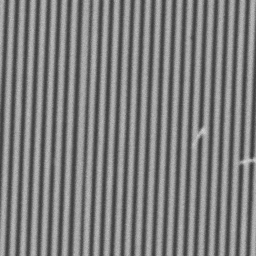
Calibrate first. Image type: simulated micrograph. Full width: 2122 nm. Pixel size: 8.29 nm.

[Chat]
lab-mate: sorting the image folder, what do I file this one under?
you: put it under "parallel lines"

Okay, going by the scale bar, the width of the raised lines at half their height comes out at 47.6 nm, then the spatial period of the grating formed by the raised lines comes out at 86.7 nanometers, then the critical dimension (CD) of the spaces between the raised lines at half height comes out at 0.0393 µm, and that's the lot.